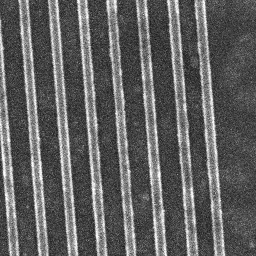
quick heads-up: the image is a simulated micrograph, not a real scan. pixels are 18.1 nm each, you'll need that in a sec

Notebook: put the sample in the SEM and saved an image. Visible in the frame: parallel lines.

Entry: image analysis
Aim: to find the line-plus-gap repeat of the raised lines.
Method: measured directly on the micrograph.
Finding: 530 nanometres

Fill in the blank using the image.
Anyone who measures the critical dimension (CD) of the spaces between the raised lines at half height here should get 0.363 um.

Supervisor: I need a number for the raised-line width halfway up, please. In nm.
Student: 171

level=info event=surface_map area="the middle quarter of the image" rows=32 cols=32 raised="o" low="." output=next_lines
.....oo.....oo......oo.....oo...
.....oo.....oo......oo.....ooo..
.....oo.....oo......oo......oo..
.....oo.....oo......oo......oo..
.....oo......o......oo......oo..
.....oo......o......oo......oo..
.....ooo.....oo.....oo......oo..
.....ooo.....oo.....ooo.....oo..
.....ooo.....oo.....ooo.....oo..
.....ooo.....oo.....ooo.....oo..
.....ooo.....oo.....ooo.....oo..
......oo.....oo.....ooo.....oo..
o.....oo.....oo......oo.....ooo.
o.....oo.....oo......oo.....oo..
o.....oo.....oo......oo......oo.
o.....oo.....oo......oo.....ooo.
o.....oo.....oo......oo......oo.
o.....oo.....oo......oo......oo.
o.....oo.....ooo.....oo......oo.
o.....oo.....ooo.....oo......oo.
o.....ooo.....oo.....oo......oo.
o.....ooo.....oo.....oo......oo.
o......oo.....oo.....oo......oo.
o......oo.....oo.....oo......oo.
oo.....oo.....oo.....ooo.....ooo
oo.....oo.....oo.....ooo.....ooo
oo.....oo.....oo......oo......oo
oo.....oo.....ooo.....oo......oo
oo.....oo.....oo......oo......oo
oo.....oo.....ooo.....oo......oo
oo.....oo.....ooo.....oo......oo
oo.....oo.....oo......oo......oo